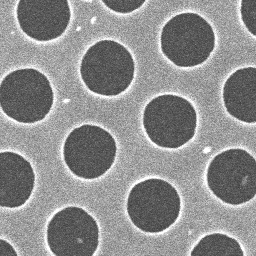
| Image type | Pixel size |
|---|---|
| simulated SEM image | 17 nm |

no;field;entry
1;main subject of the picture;holes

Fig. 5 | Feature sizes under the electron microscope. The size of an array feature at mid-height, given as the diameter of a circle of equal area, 0.93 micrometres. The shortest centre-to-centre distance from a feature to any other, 1.41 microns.